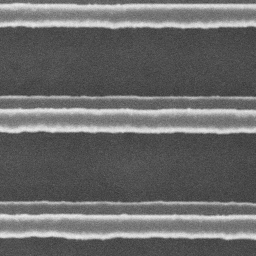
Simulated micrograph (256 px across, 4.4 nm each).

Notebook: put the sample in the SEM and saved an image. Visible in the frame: lines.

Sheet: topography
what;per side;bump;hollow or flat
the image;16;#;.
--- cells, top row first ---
################
################
................
................
................
................
################
################
................
................
................
................
................
################
################
................